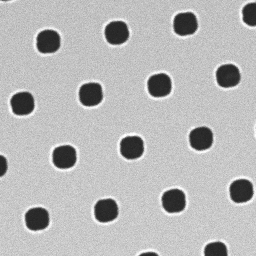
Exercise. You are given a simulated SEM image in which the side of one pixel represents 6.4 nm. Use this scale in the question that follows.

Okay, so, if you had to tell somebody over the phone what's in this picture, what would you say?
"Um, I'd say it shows a regular array of holes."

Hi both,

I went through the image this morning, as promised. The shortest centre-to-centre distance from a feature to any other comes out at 429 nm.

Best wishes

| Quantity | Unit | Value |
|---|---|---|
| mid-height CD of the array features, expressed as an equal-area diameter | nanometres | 160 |